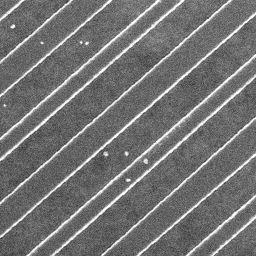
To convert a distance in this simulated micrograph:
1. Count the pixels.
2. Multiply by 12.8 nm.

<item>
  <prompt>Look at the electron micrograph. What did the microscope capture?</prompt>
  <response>lines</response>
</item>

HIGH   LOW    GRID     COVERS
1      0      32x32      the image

11000000111110000001110000001111
10000001111100000011100000011111
00000011111000000111000000111110
00000111110000001110000001111100
00001111100000011100000011111000
00011111000000111000000111110000
01111100000011110000011111100000
11111000000111000000111110000001
11110000001110000001111100000011
11100000011100000011111000000111
11000000111000000111110000001110
10000001110000001111100000011100
00000111100000011111000000111000
00001111000001111110000011110000
00011100000011111000000111000000
00111000000111110000001110000001
01110000001111100000011100000011
11100000011111000000111000000111
11000000111110000001110000001111
10000001111100000011100000011111
00000111111000001111000001111110
00001111100000011110000011111100
00011111000000111000000111110000
00111110000001110000001111100000
01111100000011100000011111000000
11111000000111000000111110000001
11110000001110000001111100000011
11100000011100000011111000001111
10000001111000000111100000011110
00000011100000011111000000111000
00000111000000111110000001110000
00001110000001111100000011100000